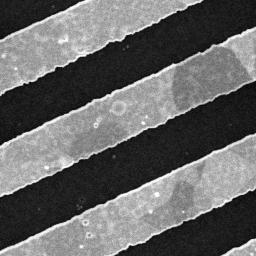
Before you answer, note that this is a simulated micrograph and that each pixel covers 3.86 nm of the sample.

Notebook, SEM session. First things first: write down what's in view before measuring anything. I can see lines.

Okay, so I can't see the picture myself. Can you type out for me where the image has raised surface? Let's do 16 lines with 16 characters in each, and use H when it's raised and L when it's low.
LLLLHHHHHHHHLLLL
LLHHHHHHHHLLLLLL
HHHHHHHLLLLLLLHH
HHHHHLLLLLLLHHHH
HHHLLLLLLLHHHHHH
HLLLLLLLHHHHHHHL
LLLLLHHHHHHHHLLL
LLLHHHHHHHHLLLLL
LHHHHHHHLLLLLLLL
HHHHHHLLLLLLLHHH
HHHHLLLLLLLHHHHH
HHLLLLLLLHHHHHHH
LLLLLLLHHHHHHHLL
LLLLLHHHHHHHLLLL
LLLHHHHHHHLLLLLL
HHHHHHHHLLLLLLLH